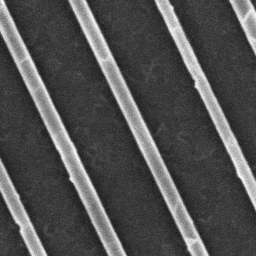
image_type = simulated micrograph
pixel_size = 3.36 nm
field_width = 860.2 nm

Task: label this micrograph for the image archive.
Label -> one or a few lines or trenches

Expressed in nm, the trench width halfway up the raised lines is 201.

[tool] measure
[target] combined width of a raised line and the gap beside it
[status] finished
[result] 250 nanometers